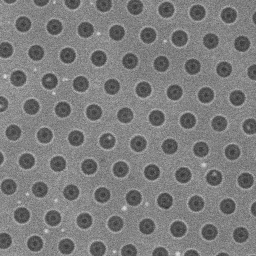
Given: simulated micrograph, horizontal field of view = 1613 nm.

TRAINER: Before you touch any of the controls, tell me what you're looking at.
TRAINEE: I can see an array of small figures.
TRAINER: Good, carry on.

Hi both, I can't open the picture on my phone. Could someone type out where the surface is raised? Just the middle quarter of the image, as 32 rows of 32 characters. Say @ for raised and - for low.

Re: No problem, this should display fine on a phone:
@@@@@@@@--@@@@@---@@@@----@@@@--
@@@@@@@@@@@@@@@@@@@@@@@---@@@@--
@@@@@@@@@@@@@@@@@@@@@@@@@@@@@@@-
@@@---@@@@@@@@@@@@@@@@@@@@@@@@@@
@@----@@@@----@@@@@--@@@@@@@@@@@
@@----@@@@----@@@@----@@@@---@@@
@@@---@@@@----@@@@----@@@@----@@
@@@@@@@@@@@--@@@@@----@@@@----@@
@@@@@@@@@@@@@@@@@@@--@@@@@---@@@
-@@@@@@@@@@@@@@@@@@@@@@@@@@@@@@@
--@@@@---@@@@@@@@@@@@@@@@@@@@@@@
--@@@-----@@@@---@@@@@--@@@@@@@@
--@@@-----@@@----@@@@----@@@@@--
@@@@@@---@@@@----@@@@----@@@@---
@@@@@@@@@@@@@@---@@@@----@@@@---
@@@@@@@@@@@@@@@@@@@@@@--@@@@@---
@@--@@@@@@@@@@@@@@@@@@@@@@@@@@@@
@----@@@@@--@@@@@@@@@@@@@@@@@@@@
@----@@@@--@-@@@@---@@@@@@-@@@@@
@----@@@@----@@@-----@@@@---@@@@
@@--@@@@@----@@@-----@@@-----@@@
@@@@@@@@@@@@@@@@@---@@@@----@@@@
@@@@@@@@@@@@@@@@@@@@@@@@@--@@@@@
@@@@@@-@@@@@@@@@@@@@@@@@@@@@@@@@
-@@@@---@@@@@--@@@@@@@@@@@@@@@@@
-@@@-----@@@----@@@@@--@@@@@@@@@
@@@@----@@@@----@@@@----@@@@----
@@@@@---@@@@----@@@@----@@@@----
@@@@@@@@@@@@@--@@@@@----@@@@----
@@@@@@@@@@@@@@@@@@@@@@@@@@@@---@
---@@@@@@@@@@@@@@@@@@@@@@@@@@@@@
----@@@@---@@@@@@-@@@@@@@@@@@@@@